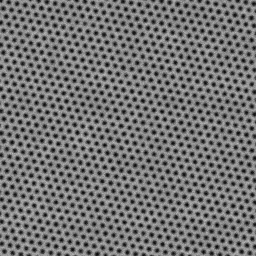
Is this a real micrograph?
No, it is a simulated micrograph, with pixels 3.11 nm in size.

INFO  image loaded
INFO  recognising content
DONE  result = a regular array of holes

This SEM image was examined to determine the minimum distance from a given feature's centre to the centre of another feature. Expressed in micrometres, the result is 0.0249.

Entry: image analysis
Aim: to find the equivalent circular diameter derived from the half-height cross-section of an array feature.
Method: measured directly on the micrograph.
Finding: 14.5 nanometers